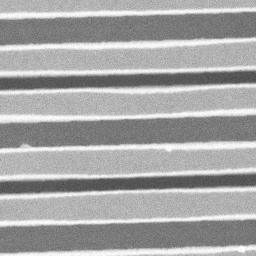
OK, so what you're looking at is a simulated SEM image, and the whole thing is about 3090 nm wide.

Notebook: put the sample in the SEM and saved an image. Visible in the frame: lines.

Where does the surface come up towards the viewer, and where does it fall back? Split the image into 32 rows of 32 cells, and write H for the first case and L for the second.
HHHHHHHHHHHHHHHHHHHHHHHHHHHHHHHH
HHHHHHHHHHHHHHHHHHHHHHHHHHHHHLLL
LLLLLLLLLLLLLLLLLLLLLLLLLLLLLLLL
LLLLLLLLLLLLLLLLLLLLLLLLLLLLLLLL
LLLLLLLLLLLLLLLLLLLLLLLLLLLLLLLL
LLLLLLLLLLLLLLHHHHHHHHHHHHHHHHHH
HHHHHHHHHHHHHHHHHHHHHHHHHHHHHHHH
HHHHHHHHHHHHHHHHHHHHHHHHHHHHHHHH
HHHHHHHHHHHHHHHHHHHHHHHHHHHHHHHH
HHLLLLLLLLLLLLLLLLLLLLLLLLLLLLLL
LLLLLLLLLLLLLLLLLLLLLLLLLLLLLLLL
HHHHHHHHHHHHHHHHHHHHHHHHHHHHHHHH
HHHHHHHHHHHHHHHHHHHHHHHHHHHHHHHH
HHHHHHHHHHHHHHHHHHHHHHHHHHHHHHHH
HHHHHHHHHHHHHHHHHHHHHHHLLLLLLLLL
LLLLLLLLLLLLLLLLLLLLLLLLLLLLLLLL
LLLLLLLLLLLLLLLLLLLLLLLLLLLLLLLL
LLLLLLLLLLLLLLLLLLLLLLLLLLLLLLLL
LLLLLHHHHHHHHHHHHHHHHHHHHHHHHHHH
HHHHHHHHHHHHHHHHHHHHHHHHHHHHHHHH
HHHHHHHHHHHHHHHHHHHHHHHHHHHHHHHH
HHHHHHHHHHHHHHHHHHHHHHHHHHHHHHHH
LLLLLLLLLLLLLLLLLLLLLLLLLLLLLLLL
LLLLLLLLLLLLLLLLLLLLLLLLLLLHHHHH
HHHHHHHHHHHHHHHHHHHHHHHHHHHHHHHH
HHHHHHHHHHHHHHHHHHHHHHHHHHHHHHHH
HHHHHHHHHHHHHHHHHHHHHHHHHHHHHHHH
HHHHHHHHHHHHHHHHHHHHHHHHLLLLLLLL
LLLLLLLLLLLLLLLLLLLLLLLLLLLLLLLL
LLLLLLLLLLLLLLLLLLLLLLLLLLLLLLLL
LLLLLLLLLLLLLLLLLLLLLLLLLLLLLLLL
LLLLLLLLLLHHHHHHHHHHHHHHHHHHHHHH